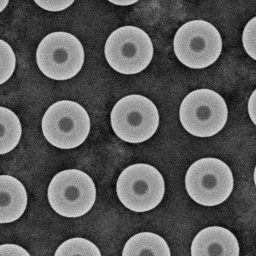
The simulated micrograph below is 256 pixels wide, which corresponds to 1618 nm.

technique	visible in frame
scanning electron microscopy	an array of small figures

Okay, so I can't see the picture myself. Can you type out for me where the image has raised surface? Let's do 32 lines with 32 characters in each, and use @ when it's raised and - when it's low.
@----@@@@-----@@----------------
--------------------------------
-------------------------------@
---------------@@------@@@@----@
------@@@-----@@@@----@@@@@@--@@
@----@@@@@---@@@@@@---@@@@@@--@@
@@---@@@@@---@@@@@@---@@@@@@---@
@@---@@@@@---@@@@@@---@@@@@-----
@@---@@@@@----@@@@------@-------
@-----@@@-----------------------
--------------------------------
------------------------@@@-----
---------------@@@@----@@@@@---@
@-----@@@@----@@@@@----@@@@@---@
@@---@@@@@@---@@@@@@--@@@@@@---@
@@@--@@@@@@---@@@@@@---@@@@@----
@@@--@@@@@@---@@@@@-----@@@-----
@@----@@@@@----@@@--------------
@@------@-----------------------
--------------------------------
------------------------@@@@----
--------@@-----@@@@@---@@@@@@---
@@-----@@@@----@@@@@---@@@@@@---
@@@---@@@@@@---@@@@@@--@@@@@@---
@@@---@@@@@@---@@@@@----@@@@@---
@@@---@@@@@@---@@@@@-----@@-----
@@@----@@@@---------------------
@@------------------------------
--------------------------@@----
-----------------@@@-----@@@@---
--------@@@@----@@@@@---@@@@@@--
@@@----@@@@@---@@@@@@---@@@@@@--